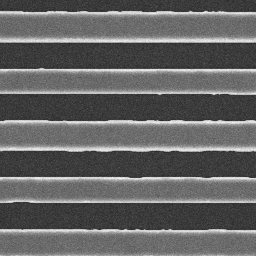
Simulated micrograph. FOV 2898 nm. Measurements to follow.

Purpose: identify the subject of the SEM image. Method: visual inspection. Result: lines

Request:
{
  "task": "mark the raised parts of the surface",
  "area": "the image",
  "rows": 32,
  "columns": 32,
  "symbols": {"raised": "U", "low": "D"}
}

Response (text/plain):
DDDDDDDDDDDDDDDDDDDDDDDDDDDDDDDD
DDDDDDDDDDDDDDDDDDDDDDDDDDDDDDDD
UUUUUUUUUUUUUUUUUUUUUUUUUUUUUUUU
UUUUUUUUUUUUUUUUUUUUUUUUUUUUUUUU
UUUUUUUUUUUUUUUUUUUUUUUUUUUUUUUU
DDDDDDDDDDDDDDDDDDDDDDDDDDDDDDDD
DDDDDDDDDDDDDDDDDDDDDDDDDDDDDDDD
DDDDDDDDDDDDDDDDDDDDDDDDDDDDDDDD
DDDDDDDDDDDDDDDDDDDDDDDDDDDDDDDD
UUUUUUUUUUUUUUUUUUUUUUUUUUUUUUUU
UUUUUUUUUUUUUUUUUUUUUUUUUUUUUUUU
UUUUUUUUUUUUUUUUUUUUUUUUUUUUUUUU
DDDDDDDDDDDDDDDDDDDDDDDDDDDDDDDD
DDDDDDDDDDDDDDDDDDDDDDDDDDDDDDDD
DDDDDDDDDDDDDDDDDDDDDDDDDDDDDDDD
UUUUUUUUUUUUUUUUUUUUUUUUUUUUUUUU
UUUUUUUUUUUUUUUUUUUUUUUUUUUUUUUU
UUUUUUUUUUUUUUUUUUUUUUUUUUUUUUUU
UUUUUUUUUUUUUUUUUUUUUUUUUUUUUUUU
DDDDDDDDDDDDDDDDDDDDDDDDDDDDDDDD
DDDDDDDDDDDDDDDDDDDDDDDDDDDDDDDD
DDDDDDDDDDDDDDDDDDDDDDDDDDDDDDDD
UUUUUUUUUUUUUUUUUUUUUUUUUUUUUUUU
UUUUUUUUUUUUUUUUUUUUUUUUUUUUUUUU
UUUUUUUUUUUUUUUUUUUUUUUUUUUUUUUU
DDDDDDDDDDDDDDDDDDDDDDDDDDDDDDDD
DDDDDDDDDDDDDDDDDDDDDDDDDDDDDDDD
DDDDDDDDDDDDDDDDDDDDDDDDDDDDDDDD
DDDDDDDDDDDDDDDDDDDDDDDDDDDDDDDD
UUUUUUUUUUUUUUUUUUUUUUUUUUUUUUUU
UUUUUUUUUUUUUUUUUUUUUUUUUUUUUUUU
UUUUUUUUUUUUUUUUUUUUUUUUUUUUUUUU